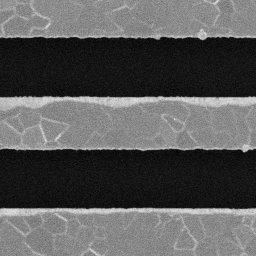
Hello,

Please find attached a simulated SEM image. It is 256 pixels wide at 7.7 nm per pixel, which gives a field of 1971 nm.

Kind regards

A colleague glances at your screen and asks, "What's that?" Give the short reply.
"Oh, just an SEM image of lines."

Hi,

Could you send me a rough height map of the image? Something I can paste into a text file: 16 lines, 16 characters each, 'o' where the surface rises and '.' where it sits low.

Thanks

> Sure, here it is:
oooooooooooooooo
oooooooooooooooo
................
................
................
................
oooooooooooooooo
oooooooooooooooo
oooooooooooooooo
................
................
................
................
oooooooooooooooo
oooooooooooooooo
oooooooooooooooo